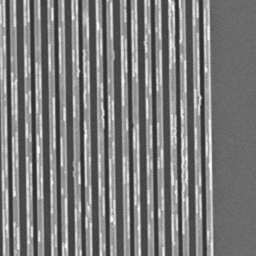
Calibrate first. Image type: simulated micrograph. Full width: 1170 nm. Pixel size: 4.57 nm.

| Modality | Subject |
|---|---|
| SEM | parallel lines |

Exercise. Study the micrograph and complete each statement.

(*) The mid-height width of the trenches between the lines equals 5.38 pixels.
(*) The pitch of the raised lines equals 54.9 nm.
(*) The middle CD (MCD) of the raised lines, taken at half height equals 6.13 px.